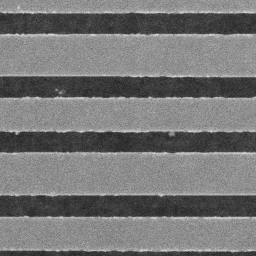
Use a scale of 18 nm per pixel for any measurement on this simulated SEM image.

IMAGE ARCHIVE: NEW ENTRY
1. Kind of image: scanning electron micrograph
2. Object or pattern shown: lines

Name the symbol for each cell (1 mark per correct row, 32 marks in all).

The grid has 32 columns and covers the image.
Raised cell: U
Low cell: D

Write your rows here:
UUUUUUUUUUUUUUUUUUUUUUUUUUUUUUUU
UUUUUUUUUUUUUUUUUUUUUUUUUUUUUUUU
DDDDDDDDDDDDDDDDDDDDDDDDDDDDDDDD
DDDDDDDDDDDDDDDDDDDDDDDDDDDDDDDD
UUUUUUUUUUUUUUUUUUUUUUUUUUUUUUUU
UUUUUUUUUUUUUUUUUUUUUUUUUUUUUUUU
UUUUUUUUUUUUUUUUUUUUUUUUUUUUUUUU
UUUUUUUUUUUUUUUUUUUUUUUUUUUUUUUU
UUUUUUUUUUUUUUUUUUUUUUUUUUUUUUUU
DDDDDDDDDDDDDDDUUUUUUUUUUUUUUUUU
DDDDDDDDDDDDDDDDDDDDDDDDDDDDDDDD
DDDDDDDDDDDDDDDDDDDDDDDDDDDDDDDD
UUUUUUUUUUUUUUUUUUUUUUUUUUUUUUUU
UUUUUUUUUUUUUUUUUUUUUUUUUUUUUUUU
UUUUUUUUUUUUUUUUUUUUUUUUUUUUUUUU
UUUUUUUUUUUUUUUUUUUUUUUUUUUUUUUU
DDDDDDDDDDDDDDDDDDDDDDDDDDDDDDDD
DDDDDDDDDDDDDDDDDDDDDDDDDDDDDDDD
DDDDDDDDDDDDDDDDDDDDDDDDDDDDDDDD
UUUUUUUUUUUUUUUUUUUUUUUUUUUUUUUU
UUUUUUUUUUUUUUUUUUUUUUUUUUUUUUUU
UUUUUUUUUUUUUUUUUUUUUUUUUUUUUUUU
UUUUUUUUUUUUUUUUUUUUUUUUUUUUUUUU
UUUUUUUUUUUUUUUUUUUUUUUUUUUUUUUU
DDDDDDDDDDDDDDDDDDDDDDDDDDDDDDDD
DDDDDDDDDDDDDDDDDDDDDDDDDDDDDDDD
DDDDDDDDDDDDDDDDDDDDDDDDDDDDDDDD
UUUUUUUUUUUUUUUUUUUUUUUUUUUUUUUU
UUUUUUUUUUUUUUUUUUUUUUUUUUUUUUUU
UUUUUUUUUUUUUUUUUUUUUUUUUUUUUUUU
UUUUUUUUUUUUUUUUUUUUUUUUUUUUUUUU
DDDDDDDDDDDDDDDDDDDDDDDDDDDDDDDD